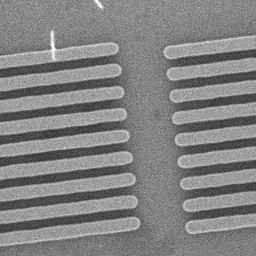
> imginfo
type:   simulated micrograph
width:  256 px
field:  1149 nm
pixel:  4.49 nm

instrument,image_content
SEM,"groups of lines, slits or small figures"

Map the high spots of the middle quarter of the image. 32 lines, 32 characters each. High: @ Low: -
--------@@@@@@-----------------@
-@@@@@@@@@@@@@------------@@@@@@
@@@@@@@@@@@@@@------------@@@@@@
@@@@@@@@@@----------------@@@@@@
@@------------------------------
--------------------------------
-----@@@@@@@@@@-------------@@@@
@@@@@@@@@@@@@@@-----------@@@@@@
@@@@@@@@@@@@@@------------@@@@@@
@@@@@@@--------------------@@---
--------------------------------
----------@@@@@-----------------
--@@@@@@@@@@@@@@-----------@@@@@
@@@@@@@@@@@@@@@------------@@@@@
@@@@@@@@@@-----------------@@@@@
@@------------------------------
--------------------------------
------@@@@@@@@@@-------------@@@
@@@@@@@@@@@@@@@@------------@@@@
@@@@@@@@@@@@@@@-------------@@@@
@@@@@@@-------------------------
--------------------------------
-----------@@@@@@---------------
----@@@@@@@@@@@@@------------@@@
@@@@@@@@@@@@@@@@@------------@@@
@@@@@@@@@@-------------------@@@
@@@-----------------------------
---------------@@---------------
--------@@@@@@@@@@-------------@
@@@@@@@@@@@@@@@@@@-----------@@@
@@@@@@@@@@@@@@@--------------@@@
@@@@@@@@------------------------